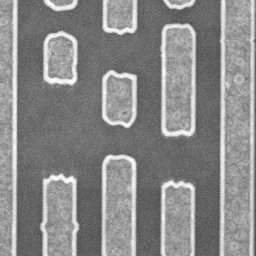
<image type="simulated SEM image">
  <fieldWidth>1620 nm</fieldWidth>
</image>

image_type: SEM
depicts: parallel lines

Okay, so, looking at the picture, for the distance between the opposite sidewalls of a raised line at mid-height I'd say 201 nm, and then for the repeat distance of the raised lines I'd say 374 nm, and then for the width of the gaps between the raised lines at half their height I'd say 174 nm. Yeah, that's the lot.